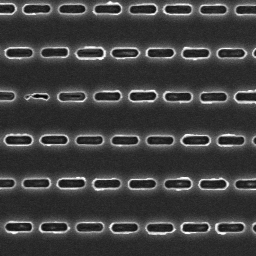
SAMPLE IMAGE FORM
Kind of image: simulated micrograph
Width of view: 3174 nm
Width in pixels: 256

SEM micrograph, a regular array of holes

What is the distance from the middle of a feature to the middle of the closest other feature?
435 nm